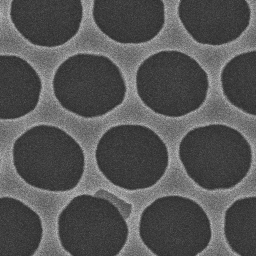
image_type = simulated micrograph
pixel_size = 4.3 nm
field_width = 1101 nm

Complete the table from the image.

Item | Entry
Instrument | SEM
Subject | holes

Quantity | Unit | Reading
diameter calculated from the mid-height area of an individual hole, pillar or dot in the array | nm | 298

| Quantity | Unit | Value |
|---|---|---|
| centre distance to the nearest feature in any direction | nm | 358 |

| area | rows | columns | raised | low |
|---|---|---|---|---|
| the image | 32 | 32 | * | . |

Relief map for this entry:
*.........**........**.........*
*.........**.........*.........*
*.........**.........**........*
**........**........***........*
***......****......*****......**
****....*****************...****
********************...********.
...*****......****......*****...
....***........**........***....
.....**........**.........**....
.....**.........*.........**....
.....**.........*.........**....
.....**........***........***...
....****......*****......*****..
...*******...********..*********
********************************
***.....*****......*****......**
**.......***........***........*
**........**.........*.........*
**.........*.........*..........
**.........*.........**........*
**........***........**........*
***.......****......****......**
*****....******...*******....***
**********..*********..*********
...******.....*****......****...
....****.......***........**....
.....**.........**........**....
.....**.........*.........**....
.....**.........*.........**....
.....***........**........**....
....*****......****......****...